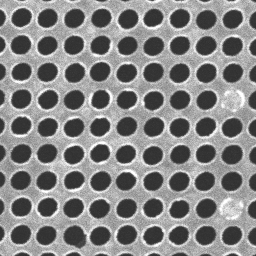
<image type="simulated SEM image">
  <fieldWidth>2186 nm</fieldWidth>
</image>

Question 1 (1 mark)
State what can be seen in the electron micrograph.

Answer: a regular array of holes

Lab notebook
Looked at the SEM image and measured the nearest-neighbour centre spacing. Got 222 nm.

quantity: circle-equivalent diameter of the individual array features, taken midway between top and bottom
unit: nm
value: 173